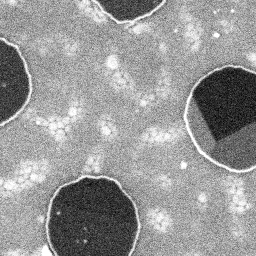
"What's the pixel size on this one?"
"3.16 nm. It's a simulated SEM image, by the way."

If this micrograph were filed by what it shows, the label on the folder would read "raised bodies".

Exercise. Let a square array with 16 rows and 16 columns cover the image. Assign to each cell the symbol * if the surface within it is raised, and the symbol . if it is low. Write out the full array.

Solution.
......****......
................
................
*...............
**...........***
**..........****
**..........****
*...........****
............****
.............***
..............**
....***.........
...*****........
...******.......
...******.......
...*****........